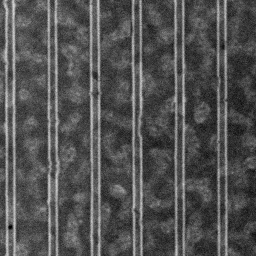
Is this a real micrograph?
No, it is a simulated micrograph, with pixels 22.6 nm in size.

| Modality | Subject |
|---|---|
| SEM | parallel lines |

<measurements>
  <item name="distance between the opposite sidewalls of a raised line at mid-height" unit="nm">167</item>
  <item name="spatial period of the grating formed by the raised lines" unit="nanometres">960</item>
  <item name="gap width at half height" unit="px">35.3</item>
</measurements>